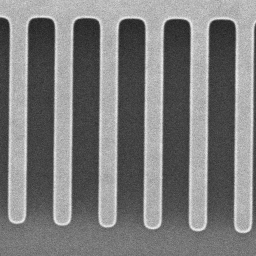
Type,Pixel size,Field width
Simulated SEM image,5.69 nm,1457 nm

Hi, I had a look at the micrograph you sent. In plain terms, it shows groups of lines, slits or small figures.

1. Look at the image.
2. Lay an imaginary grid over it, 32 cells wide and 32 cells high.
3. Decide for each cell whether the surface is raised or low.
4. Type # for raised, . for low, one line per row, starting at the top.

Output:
################################
################################
.###..####..###...###..####..###
.###...##....##...##....##....##
.##....##....##...##....##....##
.##....##....##...##....##....##
.##....##....##...##....##....##
.##....##....##...##....##....##
.##....##....##...##....##....##
.##....##....##...##....##....##
.##....##....##...##....##....##
.##....##....##...##....##....##
.##....##....##...##....##....##
.##....##...###...##....##....##
.##....##...###...##....##....##
.##....##...###...##....##....##
.##....##...###...##....##...###
.##....##...###...##....##...###
.##....##...###...##....##...###
.##....##...###...##....##...##.
.##....##...###...##....##...##.
.##....##...###...##....##...##.
.##....##...###...##....##...##.
.##....##...###...##....##...##.
.##....##...###...##....##...##.
.##....##...###...##....##...##.
.##....##...###...##....##...##.
.##....##...##....##....##...##.
...................#....#....##.
................................
................................
................................